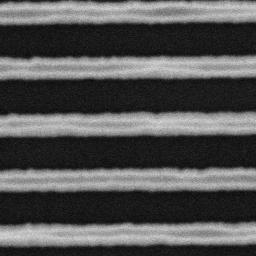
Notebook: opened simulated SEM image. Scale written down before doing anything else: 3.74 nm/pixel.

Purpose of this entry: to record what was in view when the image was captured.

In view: lines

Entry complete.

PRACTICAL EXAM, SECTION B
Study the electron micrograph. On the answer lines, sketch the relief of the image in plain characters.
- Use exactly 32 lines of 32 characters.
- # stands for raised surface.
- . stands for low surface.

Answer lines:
.###.#######...#################
################################
########################........
................................
................................
................................
................................
###.############################
################################
################................
................................
................................
................................
................................
.##########.#######.######.#####
################################
########.#########.#...####.####
................................
................................
................................
................................
.###############################
################################
###########.#.....####..####....
................................
................................
................................
................................
.###############################
################################
................................
................................